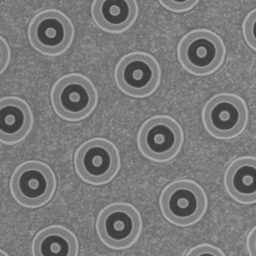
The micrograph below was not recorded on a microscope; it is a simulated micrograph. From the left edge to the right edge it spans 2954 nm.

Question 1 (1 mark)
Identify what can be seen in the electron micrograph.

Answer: a regular array of ring-shaped raised bodies with a dot in the middle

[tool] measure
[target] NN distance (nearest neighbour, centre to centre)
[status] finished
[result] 782 nm